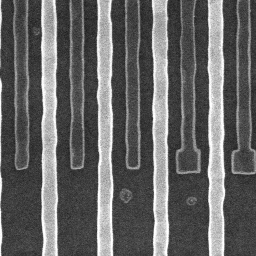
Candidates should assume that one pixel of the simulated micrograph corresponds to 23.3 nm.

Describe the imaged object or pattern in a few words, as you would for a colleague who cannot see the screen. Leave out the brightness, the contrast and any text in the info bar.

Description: wiring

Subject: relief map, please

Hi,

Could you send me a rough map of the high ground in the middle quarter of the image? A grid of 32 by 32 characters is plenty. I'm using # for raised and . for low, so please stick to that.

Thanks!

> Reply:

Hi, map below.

..###....###....###....##....###
..###....###....###....##....###
..###....###....###....###...###
..###....##.....###....###....##
..###....##.....###....###....##
..###....##.....###....###....##
..###....###....###....###....##
..###...####....###....###....##
..###...####....###...####....##
..###....##.....###...####....##
..###....###....###...####....##
..###....###....###...####....##
..###....###....###...####....##
..###....###....###...####....##
..###....###....###...####....##
..###....###....###...####....##
..###....###....###...####....##
..###....###....###...####....##
..###....###....###...###.....##
..###....###....###....##.....##
..###....###....###....##.....##
..###....###....###....###...###
..###....##.....###....###..####
..###....##.....###....###..####
..###....##.....###....###..####
..###....###....###....###..####
.........###...........###...###
.........###...........###......
.........###...........###......
.........###...........###......
.........###...........###......
.........###...........###......